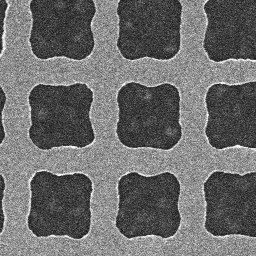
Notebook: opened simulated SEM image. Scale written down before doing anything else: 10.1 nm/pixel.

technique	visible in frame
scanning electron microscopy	holes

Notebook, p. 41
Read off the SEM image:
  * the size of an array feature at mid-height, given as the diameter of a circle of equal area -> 701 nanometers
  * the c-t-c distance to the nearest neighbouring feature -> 888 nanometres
